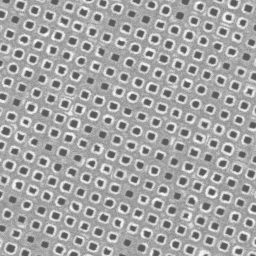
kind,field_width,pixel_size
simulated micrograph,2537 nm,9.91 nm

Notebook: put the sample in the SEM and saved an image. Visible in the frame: a regular array of holes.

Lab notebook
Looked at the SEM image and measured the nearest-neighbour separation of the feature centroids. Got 149 nm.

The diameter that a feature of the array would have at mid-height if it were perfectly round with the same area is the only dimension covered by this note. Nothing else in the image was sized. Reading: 71.6 nm